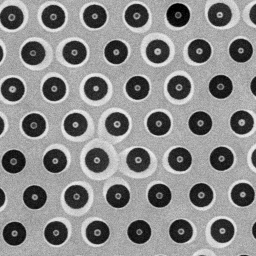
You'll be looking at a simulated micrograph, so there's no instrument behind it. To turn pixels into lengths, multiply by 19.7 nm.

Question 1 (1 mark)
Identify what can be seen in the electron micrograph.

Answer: an array of small figures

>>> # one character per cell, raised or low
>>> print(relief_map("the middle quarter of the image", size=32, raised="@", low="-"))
@@-@@@@@@@@@@@@@@@@@@@@@@@@@@@@@
@@@@@@@@@@@@@@@@@@@@@@@@@@@@@@@@
@@@@@@@@@@@@@@@@@@@@@@@@@@@@--@@
@@@@@@----@@@@@@@----@@@@@-----@
@@@@@------@@@@@-----@@@@@------
-@@@-------@@@@-------@@@---@---
-@@@--------@@@---@--@@@@-------
-@@@@------@@@@@-----@@@@@------
@@@@@------@@@@@----@@@@@@-----@
@@@@@@---@@@@@@@@@@@@@@@@@@@-@@@
@@@@@@@@@@@@@@@@@@@@@@@@@@@@@@@@
@@@@@@@@@@@@--@@@@@@@@@@@@@@@@@@
@----@@@@@@----@@@@@@@----@@@@@@
------@@@@------@@@@@------@@@@-
------@@@--------@@@---@---@@@@-
-------@@----@---@@@---@---@@@@-
------@@@-------@@@@@-----@@@@@@
------@@@@------@@@@@@----@@@@@@
@@---@@@@@@---@@@@@@@@@@@@@@@@@@
@@@@@@@@@@@@@@@@@@@@@@@@@@@@@@@@
@@@@@@-----@@@@@@@@@@@@@@@@@@@@@
@@@@@-------@@@@-----@@@@@@----@
-@@@@-------@@@-------@@@@------
-@@@--------@@@-------@@@-------
-@@@---------@---------@@-------
-@@@@-------@@@-------@@@@------
@@@@@-------@@@-------@@@@@----@
@@@@@@-----@@@@@@---@@@@@@@@@@@@
@@@@@@@@@@@@@@@@@@@@@@@@@@@@@@@@
@@@@@@@@@@@@--@@@@@@@@@-@@@@@@@@
@----@@@@@@-----@@@@@@----@@@@@@
------@@@@------@@@@@------@@@@@